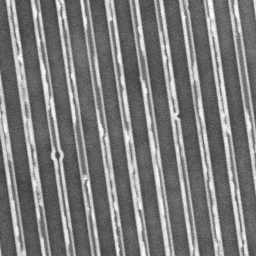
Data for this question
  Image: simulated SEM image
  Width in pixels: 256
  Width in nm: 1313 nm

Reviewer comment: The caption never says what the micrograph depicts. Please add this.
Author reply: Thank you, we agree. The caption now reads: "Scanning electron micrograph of parallel lines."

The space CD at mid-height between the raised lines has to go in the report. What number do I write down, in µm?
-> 0.0857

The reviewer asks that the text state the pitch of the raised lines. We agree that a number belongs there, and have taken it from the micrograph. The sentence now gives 0.126 micrometres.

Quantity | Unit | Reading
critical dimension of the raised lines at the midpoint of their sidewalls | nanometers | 41.3